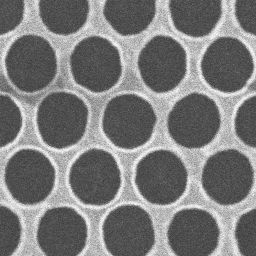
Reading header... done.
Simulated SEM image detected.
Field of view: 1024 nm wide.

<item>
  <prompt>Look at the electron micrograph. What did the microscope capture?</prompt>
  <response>a regular array of holes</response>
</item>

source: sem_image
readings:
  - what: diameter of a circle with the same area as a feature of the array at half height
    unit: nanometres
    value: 217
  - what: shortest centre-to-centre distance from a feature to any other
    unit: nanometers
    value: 260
